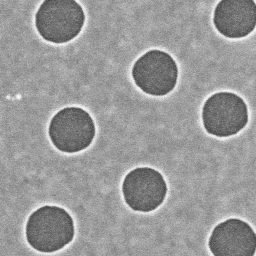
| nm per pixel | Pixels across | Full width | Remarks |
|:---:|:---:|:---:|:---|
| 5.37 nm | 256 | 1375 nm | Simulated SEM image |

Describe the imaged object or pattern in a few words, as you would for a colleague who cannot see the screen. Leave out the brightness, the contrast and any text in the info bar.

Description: holes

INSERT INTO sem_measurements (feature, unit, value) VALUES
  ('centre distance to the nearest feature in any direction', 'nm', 503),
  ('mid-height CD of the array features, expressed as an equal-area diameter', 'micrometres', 0.253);